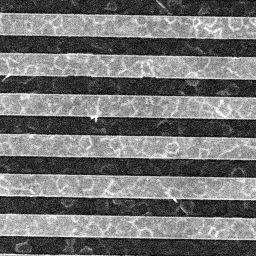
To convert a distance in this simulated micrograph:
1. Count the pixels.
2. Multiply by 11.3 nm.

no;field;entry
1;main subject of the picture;parallel lines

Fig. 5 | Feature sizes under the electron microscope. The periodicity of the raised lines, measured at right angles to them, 453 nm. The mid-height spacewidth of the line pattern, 214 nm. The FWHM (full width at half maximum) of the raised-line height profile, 0.24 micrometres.